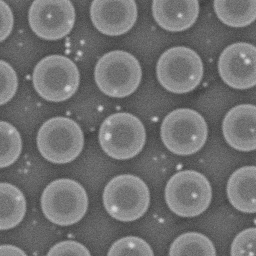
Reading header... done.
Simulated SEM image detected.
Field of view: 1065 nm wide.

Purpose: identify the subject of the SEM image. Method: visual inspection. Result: an array of small figures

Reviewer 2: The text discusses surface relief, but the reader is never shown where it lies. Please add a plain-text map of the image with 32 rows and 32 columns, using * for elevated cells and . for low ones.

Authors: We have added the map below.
*...*****...*****..******..*****
*...*****..******..******..*****
**..*****...*****...****....****
*...*****...****.....**.........
*....***........................
.............................**.
..............*......***....****
.....****....****...*****..*****
*...******..*****...*****..*****
**..******..******..*****...****
**..******..*****...*****....***
**...****....***......*.........
*.....**........................
.............................***
..............***....****...****
*.....***....*****..******..****
**...*****..******..******..****
***..*****..******..******..****
***..*****...*****...****....***
**....****....***...............
*...............................
.......................*.....***
.......**.....***....*****...***
**....****...*****...*****..****
***..******..******..*****...***
***..******..******..*****...***
***...*****...****....***.......
***...****.....*................
*...............................
.......................**.....**
.......***....****....****...***
***...*****...*****..******..***